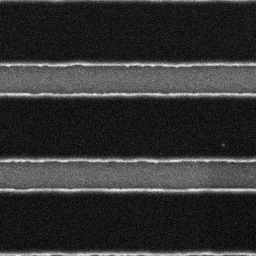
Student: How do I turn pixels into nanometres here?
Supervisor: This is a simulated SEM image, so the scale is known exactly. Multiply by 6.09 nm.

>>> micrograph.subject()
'lines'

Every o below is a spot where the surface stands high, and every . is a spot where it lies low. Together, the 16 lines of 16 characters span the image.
oooooooooooooooo
oooooooooooooooo
oooooooooooooooo
oooooooooooooooo
................
................
oooooooooooooooo
oooooooooooooooo
oooooooooooooooo
oooooooooooooooo
................
................
oooooooooooooooo
oooooooooooooooo
oooooooooooooooo
oooooooooooooooo